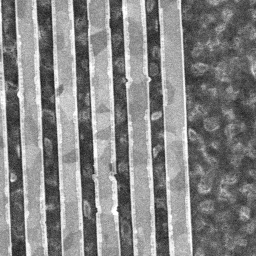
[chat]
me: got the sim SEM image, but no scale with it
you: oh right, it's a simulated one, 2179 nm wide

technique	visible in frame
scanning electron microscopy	parallel lines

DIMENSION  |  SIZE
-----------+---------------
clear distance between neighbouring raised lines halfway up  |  130 nanometers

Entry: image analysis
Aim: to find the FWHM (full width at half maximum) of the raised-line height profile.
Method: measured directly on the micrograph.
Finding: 180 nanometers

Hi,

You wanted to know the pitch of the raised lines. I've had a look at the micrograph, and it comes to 0.306 micrometres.